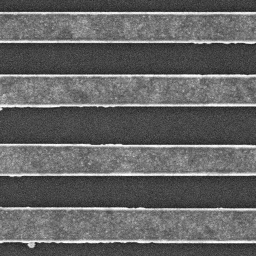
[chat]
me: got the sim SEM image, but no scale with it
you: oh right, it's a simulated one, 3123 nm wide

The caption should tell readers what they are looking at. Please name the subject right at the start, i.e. lines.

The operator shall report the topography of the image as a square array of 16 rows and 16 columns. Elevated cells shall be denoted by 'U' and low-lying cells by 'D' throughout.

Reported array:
DDDDDDDDDDDDDDDD
UUUUUUUUUUUUUUUU
UUUUUUUUUUUUUUUU
DDDDDDDDDDDDDDDD
DDDDDDDDDDDDDDDD
UUUUUUUUUUUUUUUU
UUUUUUUUUUUUUUUU
DDDDDDDDDDDDDDDD
DDDDDDDDDDDDDDDD
UUUUUUUUUUUUUUUU
UUUUUUUUUUUUUUUU
DDDDDDDDDDDDDDDD
DDDDDDDDDDDDDDDD
UUUUUUUUUUUUUUUU
UUUUUUUUUUUUUUUU
DDDDDDDDDDDDDDDD